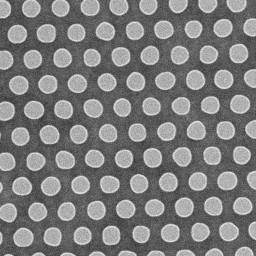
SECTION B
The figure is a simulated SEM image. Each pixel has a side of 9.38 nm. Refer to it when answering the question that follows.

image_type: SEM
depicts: an array of small figures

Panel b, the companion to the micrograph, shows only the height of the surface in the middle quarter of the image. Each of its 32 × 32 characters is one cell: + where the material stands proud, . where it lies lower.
+...............................
................................
..........+......++.....+++....+
..+++....++++...++++...+++++...+
.+++++...++++...++++...+++++...+
.+++++...++++...++++...++++....+
..+++.....++.....++.............
................................
................................
+....++++....+++....++++...++++.
++...+++++...++++...++++...++++.
++...+++++...++++...++++...++++.
++....+++....+++.....++......+..
+...............................
................................
...+......++.....+++....+++....+
..+++....++++...++++...+++++...+
..++++...++++...++++....++++...+
..++++...++++....+++....+++.....
...++...........................
................................
.....................++.....+++.
++....+++....++++...++++...+++++
++...+++++...++++...++++...+++++
++...+++++...++++...++++....+++.
++.....++.....++.....++.........
................................
.........................++.....
...++.....+++....+++....++++....
..++++...+++++...++++...++++...+
..++++...+++++...++++...++++....
..++++....+++....+++.....++.....